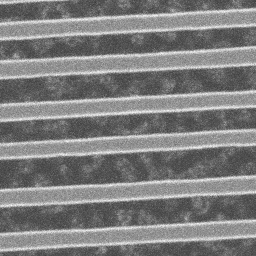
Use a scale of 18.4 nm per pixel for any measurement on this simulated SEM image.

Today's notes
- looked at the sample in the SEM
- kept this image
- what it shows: parallel lines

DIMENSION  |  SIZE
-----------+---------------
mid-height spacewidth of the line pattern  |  470 nm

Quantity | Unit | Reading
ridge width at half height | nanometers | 307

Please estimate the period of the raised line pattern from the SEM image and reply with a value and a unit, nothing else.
774 nanometres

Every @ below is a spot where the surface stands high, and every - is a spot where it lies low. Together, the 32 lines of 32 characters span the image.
--------------------------------
-------------------------@@@@@@@
-------@@@@@@@@@@@@@@@@@@@@@@@@@
@@@@@@@@@@@@@@@@@@@@@@@@@@------
@@@@@@@@------------------------
--------------------------------
----------------------@@@@@@@@@@
-@@@@@@@@@@@@@@@@@@@@@@@@@@@@@@@
@@@@@@@@@@@@@@@@@@@@@@@@@-------
@@@@@-@-------------------------
------@-------------------------
------------------------------@@
-----------@@@@@@@@@@@@@@@@@@@@@
@@@@@@@@@@@@@@@@@@@@@@@@@@@@----
@@@@@@@@@@----------------------
--------------------------------
--------------------------@@@@@@
---------@@@@@@@@@@@@@@@@@@@@@@@
@@@@@@@@@@@@@@@@@@@@@@@@--------
@@@@@@--------------------------
--------------------------------
--------------------------------
-------------------------@@@@@@@
----@-@@@@@@@@@@@@@@@@@@@@@@@@@@
@@@@@@@@@@@@@@@@@@@@@@@@--------
@@@@@@--------------------------
--------------------------------
--------------------------------
---------------@@@@@@@@@@@@@@@@@
@@@@@@@@@@@@@@@@@@@@@@@@@@@@@@@@
@@@@@@@@@@@@@@@@----------------
--------------------------------